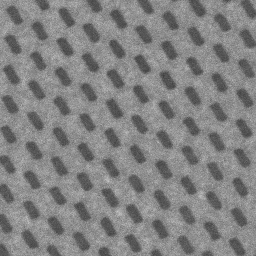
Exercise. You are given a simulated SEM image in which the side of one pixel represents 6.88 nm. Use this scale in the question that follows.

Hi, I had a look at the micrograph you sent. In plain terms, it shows a regular array of holes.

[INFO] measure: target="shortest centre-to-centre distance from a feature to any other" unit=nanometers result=202